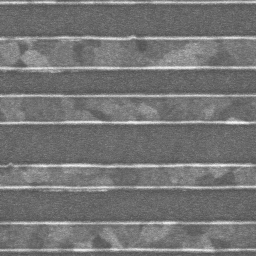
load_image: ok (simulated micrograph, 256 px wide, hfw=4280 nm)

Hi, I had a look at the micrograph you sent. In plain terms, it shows one or a few lines or trenches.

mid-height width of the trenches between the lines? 602 nm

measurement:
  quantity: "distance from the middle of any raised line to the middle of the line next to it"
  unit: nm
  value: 1020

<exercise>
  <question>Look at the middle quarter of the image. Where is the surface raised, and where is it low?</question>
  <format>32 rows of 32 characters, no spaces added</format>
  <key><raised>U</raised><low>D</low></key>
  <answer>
UUUUUUUUUUUUUUUUUUUUUUUUUUUUUUUU
DDDDDDDDDDDDDDDDDDDDDDDDDDDDDDDD
DDDDDDDDDDDDDDDDDDDDDDDDDDDDDDDD
DDDDDDDDDDDDDDDDDDDDDDDDDDDDDDDD
DDDDDDDDDDDDDDDDDDDDDDDDDDDDDDDD
DDDDDDDDDDDDDDDDDDDDDDDDDDDDDDDD
DDDDDDDDDDDDDDDDDDDDDDDDDDDDDDDD
DDDDDDDDDDDDDDDDDDDDDDDDDDDDDDDD
UUUUUUUUUUUUUUUUUUUUUUUUUUUUUUUU
UUUUUUUUUUUUUUUUUUUUUUUUUUUUUUUU
UUUUUUUUUUUUUUUUUUUUUUUUUUUUUUUU
UUUUUUUUUUUUUUUUUUUUUUUUUUUUUUUU
UUUUUUUUUUUUUUUUUUUUUUUUUUUUUUUU
UUUUUUUUUUUUUUUUUUUUUUUUUUUUUUUU
DDDDDDDDDDDDDDDDDUUUDDDDDDUUUUDD
DDDDDDDDDDDDDDDDDDDDDDDDDDDDDDDD
DDDDDDDDDDDDDDDDDDDDDDDDDDDDDDDD
DDDDDDDDDDDDDDDDDDDDDDDDDDDDDDDD
DDDDDDDDDDDDDDDDDDDDDDDDDDDDDDDD
DDDDDDDDDDDDDDDDDDDDDDDDDDDDDDDD
DDDDDDDDDDDDDDDDDDDDDDDDDDDDDDDD
DDDDDDDDDDDDDDDDDDDDDDDDDDDDDDDD
DDDDDDDDDDDDDDDDDDDDDDDDDDDDDDDD
DDDDDDDDDDDDDDDDDDDDDDDDDDDDDDDD
DDDDDDDDDDDDDDDDDDDDDDDDDDDDDDDD
UUUUUUDDDDDDDDDDDDDDDDDDDDDDUUUU
UUUUUUUUUUUUUUUUUUUUUUUUUUUUUUUU
UUUUUUUUUUUUUUUUUUUUUUUUUUUUUUUU
UUUUUUUUUUUUUUUUUUUUUUUUUUUUUUUU
UUUUUUUUUUUUUUUUUUUUUUUUUUUUUUUU
UUUUUUUUUUUUUUUUUUUUUUUUUUUUUUUU
DDDDDDDDDDDDDDDDDDDDDDDDDDDDDDDD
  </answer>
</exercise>